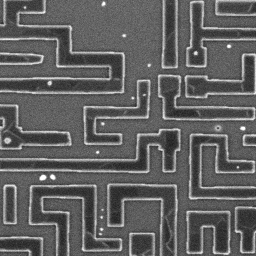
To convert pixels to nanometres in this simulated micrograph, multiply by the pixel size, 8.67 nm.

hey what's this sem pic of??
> wiring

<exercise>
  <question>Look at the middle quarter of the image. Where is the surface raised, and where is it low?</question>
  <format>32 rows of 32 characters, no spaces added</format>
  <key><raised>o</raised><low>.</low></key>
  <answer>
ooooooooooooooo..........ooo....
...........oooo.................
...........oooo.................
...........oooo.........ooooo..o
ooooooooooooooo....oo...ooooo..o
ooooooooooooooo....oo...ooooo..o
ooooooooooooooo....oo...ooooo..o
...................oo...ooooo..o
...................oo....ooo....
...................oo....ooo....
..................ooo....ooo....
.....oooooooooooooooo....ooooooo
.....oooooooooooooooo....ooooooo
.....ooo.................ooooooo
.....ooo........................
.....ooo........................
.....ooo........................
o....ooo...............oooooo...
oo...ooooooooo.....oooooooooo...
oo...ooooooooo.....oooooooooo...
...................oo...ooooo...
..................ooo...ooooo...
..................ooo....ooo....
..................ooo....ooo....
ooooooooooooooooooooo....ooo....
ooooooooooooooooooooo....ooo....
ooooooooooooooooooooo....ooo....
................................
................................
................................
...ooooo...ooooooooooooooooo...o
oooooooo...ooooooooooooooooo...o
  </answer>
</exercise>